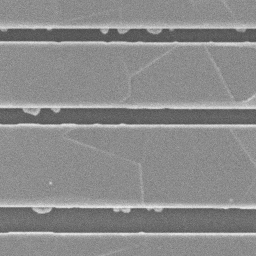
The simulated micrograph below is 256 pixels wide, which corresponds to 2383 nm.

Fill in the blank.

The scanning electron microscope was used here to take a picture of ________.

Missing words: lines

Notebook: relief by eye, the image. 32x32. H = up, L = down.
HHHHHHHHHHHHHHHHHHHHHHHHHHHHHHHH
HHHHHHHHHHHHHHHHHHHHHHHHHHHHHHHH
HHHHHHHHHHHHHHHHHHHHHHHHHHHHHHHH
LLLLLLLLLLLLLLLLLLLLLLLLLLLLLLLL
LLLLLLLLLLLLLLLLLLLLLLLLLLLLLLLL
HHHHHHHHHHHHHHHHHHHHHHHHHHHHHHHH
HHHHHHHHHHHHHHHHHHHHHHHHHHHHHHHH
HHHHHHHHHHHHHHHHHHHHHHHHHHHHHHHH
HHHHHHHHHHHHHHHHHHHHHHHHHHHHHHHH
HHHHHHHHHHHHHHHHHHHHHHHHHHHHHHHH
HHHHHHHHHHHHHHHHHHHHHHHHHHHHHHHH
HHHHHHHHHHHHHHHHHHHHHHHHHHHHHHHH
HHHHHHHHHHHHHHHHHHHHHHHHHHHHHHHH
LLLLLLLLLLLLLLLLLLLLLLLHHLLLLHLL
LLLLLLLLLLLLLLLLLLLLLLLLLLLLLLLL
LLLLLLLLLLLLLLLLLLLLLLLLLLLLLLLL
HHHHHHHHHHHHHHHHHHHHHHHHHHHHHHHH
HHHHHHHHHHHHHHHHHHHHHHHHHHHHHHHH
HHHHHHHHHHHHHHHHHHHHHHHHHHHHHHHH
HHHHHHHHHHHHHHHHHHHHHHHHHHHHHHHH
HHHHHHHHHHHHHHHHHHHHHHHHHHHHHHHH
HHHHHHHHHHHHHHHHHHHHHHHHHHHHHHHH
HHHHHHHHHHHHHHHHHHHHHHHHHHHHHHHH
HHHHHHHHHHHHHHHHHHHHHHHHHHHHHHHH
HHHHHHHHHHHHHHHHHHHHHHHHHHHHHHHH
HHHHHHHHHHHHHHHHHHHHHHHHHHHHHHHH
LLLLLLLLLLLLLLLLLLLLLLLLLLLLLLLL
LLLLLLLLLLLLLLLLLLLLLLLLLLLLLLLL
LLLLLLLLLLLLLLLLLLLLLLLLLLLLLLLL
HHHHHHHHHHHHHHHHHHHHHHHHHHHHHHHH
HHHHHHHHHHHHHHHHHHHHHHHHHHHHHHHH
HHHHHHHHHHHHHHHHHHHHHHHHHHHHHHHH